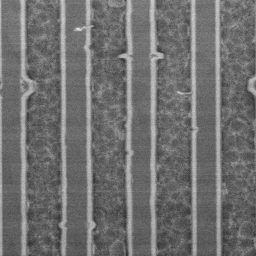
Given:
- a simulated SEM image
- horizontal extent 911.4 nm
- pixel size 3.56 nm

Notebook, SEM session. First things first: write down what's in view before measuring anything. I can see one or a few lines or trenches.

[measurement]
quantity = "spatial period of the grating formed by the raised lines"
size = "231 nm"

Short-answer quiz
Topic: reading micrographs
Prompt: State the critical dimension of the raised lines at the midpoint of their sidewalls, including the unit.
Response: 87.6 nm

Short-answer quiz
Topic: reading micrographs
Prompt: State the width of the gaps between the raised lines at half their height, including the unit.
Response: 0.144 um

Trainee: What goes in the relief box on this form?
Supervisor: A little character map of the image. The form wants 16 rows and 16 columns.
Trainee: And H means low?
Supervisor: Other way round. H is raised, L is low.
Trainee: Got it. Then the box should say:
HLLLHHLLHHLLHHLL
HLLLHHLLHHLLHHLL
HLLLHLLLHHLLHHLL
HLLLHHLLHHLLHHLL
HLLLHHLLHHLLHHLL
HHLLHLLLHHLLHHLL
HLLLHHLLHHLLHHLL
HLLLHHLLHHLLHHLL
HLLLHHLLHHLLHHLL
HLLLHHLLHHLLHHLL
HLLLHHLLHHLLHHLL
HLLLHHLLHHLLHHLL
HLLLHHLLHHLLHHLL
HLLLHHLLHHLLHHLL
HLLLHHLLHHLLHHLL
HLLLHHLLHHLLHHLL